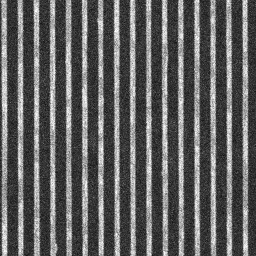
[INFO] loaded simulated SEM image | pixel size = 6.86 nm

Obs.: parallel lines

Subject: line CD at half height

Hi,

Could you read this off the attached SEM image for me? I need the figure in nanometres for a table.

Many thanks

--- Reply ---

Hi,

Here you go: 34.3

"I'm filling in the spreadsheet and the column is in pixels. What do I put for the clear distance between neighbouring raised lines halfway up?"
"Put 11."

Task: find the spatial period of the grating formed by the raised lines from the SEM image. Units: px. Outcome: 16